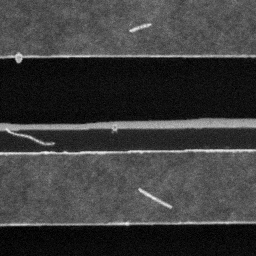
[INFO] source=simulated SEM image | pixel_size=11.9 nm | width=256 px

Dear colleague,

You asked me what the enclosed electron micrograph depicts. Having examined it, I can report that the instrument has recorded lines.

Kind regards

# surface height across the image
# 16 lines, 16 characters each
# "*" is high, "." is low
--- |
****************
****************
****************
******.*.****...
................
................
................
................
****************
****************
****************
****************
****************
****************
................
................